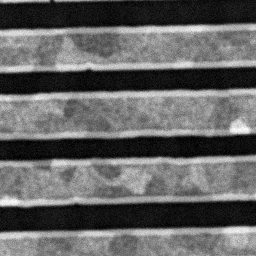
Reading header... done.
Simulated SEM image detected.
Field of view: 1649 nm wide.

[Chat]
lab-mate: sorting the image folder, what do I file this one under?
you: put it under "one or a few lines or trenches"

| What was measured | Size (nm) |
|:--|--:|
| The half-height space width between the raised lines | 173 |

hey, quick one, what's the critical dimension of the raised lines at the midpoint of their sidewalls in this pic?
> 257 nanometers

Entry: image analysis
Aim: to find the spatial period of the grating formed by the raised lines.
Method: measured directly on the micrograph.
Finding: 426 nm